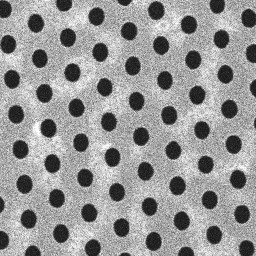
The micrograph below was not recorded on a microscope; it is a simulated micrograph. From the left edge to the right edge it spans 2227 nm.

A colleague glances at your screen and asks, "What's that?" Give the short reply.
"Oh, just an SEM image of a regular array of holes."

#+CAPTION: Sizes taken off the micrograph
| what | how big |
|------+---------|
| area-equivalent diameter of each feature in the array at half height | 17.6 px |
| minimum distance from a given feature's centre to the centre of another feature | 302 nm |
